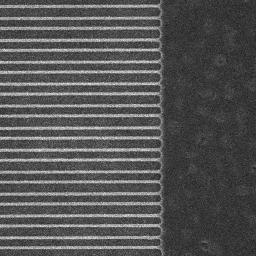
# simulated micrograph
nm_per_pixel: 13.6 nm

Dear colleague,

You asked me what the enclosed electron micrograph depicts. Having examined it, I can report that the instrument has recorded parallel lines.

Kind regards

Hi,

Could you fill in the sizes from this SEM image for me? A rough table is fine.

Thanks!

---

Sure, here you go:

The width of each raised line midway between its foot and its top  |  28.9 nm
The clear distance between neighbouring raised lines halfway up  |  107 nm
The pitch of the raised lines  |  149 nm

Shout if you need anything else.